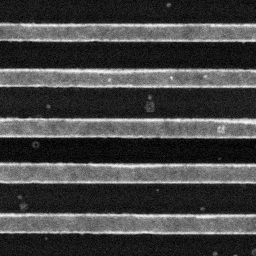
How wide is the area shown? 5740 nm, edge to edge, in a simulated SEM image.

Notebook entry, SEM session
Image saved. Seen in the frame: lines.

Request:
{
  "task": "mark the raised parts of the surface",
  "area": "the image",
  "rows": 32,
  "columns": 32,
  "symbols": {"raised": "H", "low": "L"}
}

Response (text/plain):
LLLLLLLLLLLLLLLLLLLLLLLLLLLLLLLL
LLLLLLLLLLLLLLLLLLLLLLLLLLLLLLLL
LLLLLLLLLLLLLLLLLLLLLLLLLLLLLLLL
HHHHHHHHHHHHHHHHHHHHHHHHHHHHHHHH
HHHHHHHHHHHHHHHHHHHHHHHHHHHHHHHH
LLLLLLLLLLLLLLLLLLLLLLLLLLLLLLLL
LLLLLLLLLLLLLLLLLLLLLLLLLLLLLLLL
LLLLLLLLLLLLLLLLLLLLLLLLLLLLLLLL
LLLLLLLLLLLLLLLLLLLLLLLLLLLLLLLL
HHHHHHHHHHHHHHHHHHHHHHHHHHHHHHHH
HHHHHHHHHHHHHHHHHHHHHHHHHHHHHHHH
LLLLLLLLLLLLLLLLLLLLLLLLLLLLLLLL
LLLLLLLLLLLLLLLLLLLLLLLLLLLLLLLL
LLLLLLLLLLLLLLLLLLLLLLLLLLLLLLLL
LLLLLLLLLLLLLLLLLLLLLLLLLLLLLLLL
HHHHHHHHHHHHHHHHHHHHHHHHHHHHHHHH
HHHHHHHHHHHHHHHHHHHHHHHHHHHHHHHH
LLLLLLLLLLLLLLLLLLLLLLLLLLLLLLLL
LLLLLLLLLLLLLLLLLLLLLLLLLLLLLLLL
LLLLLLLLLLLLLLLLLLLLLLLLLLLLLLLL
LLLLLLLLLLLLLLLLLLLLLLLLLLLLLLLL
HHHHHHHHHHHHHHHHHHHHHHHHHHHHHHHH
HHHHHHHHHHHHHHHHHHHHHHHHHHHHHHHH
LLLLLLLLLLLLLLLLLLLLLLLLLLLLLLLL
LLLLLLLLLLLLLLLLLLLLLLLLLLLLLLLL
LLLLLLLLLLLLLLLLLLLLLLLLLLLLLLLL
LLLLLLLLLLLLLLLLLLLLLLLLLLLLLLLL
HHHHHHHHHHHHHHHHHHHHHHHHHHHHHHHH
HHHHHHHHHHHHHHHHHHHHHHHHHHHHHHHH
LLLLLLLLLLLLLLLLLLLLLLLLLLLLLLLL
LLLLLLLLLLLLLLLLLLLLLLLLLLLLLLLL
LLLLLLLLLLLLLLLLLLLLLLLLLLLLLLLL